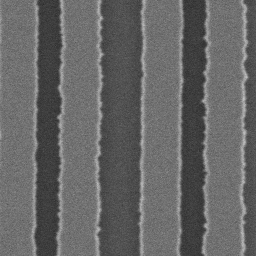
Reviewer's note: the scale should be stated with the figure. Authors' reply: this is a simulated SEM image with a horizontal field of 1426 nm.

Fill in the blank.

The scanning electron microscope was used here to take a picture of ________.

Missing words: lines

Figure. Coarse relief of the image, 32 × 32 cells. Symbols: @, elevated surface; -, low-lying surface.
@@@@@---@@@@------@@@@@---@@@@--
@@@@@---@@@@------@@@@@---@@@@@-
@@@@@---@@@@@-----@@@@@---@@@@@-
@@@@@---@@@@@-----@@@@@---@@@@@-
@@@@@---@@@@@-----@@@@@---@@@@@-
@@@@@---@@@@------@@@@@---@@@@@-
@@@@@---@@@@@-----@@@@@---@@@@@-
@@@@@---@@@@------@@@@@---@@@@@-
@@@@@---@@@@@-----@@@@@---@@@@--
@@@@@---@@@@@-----@@@@@---@@@@@-
@@@@@---@@@@@-----@@@@@---@@@@--
@@@@@--@@@@@------@@@@@---@@@@@-
@@@@@---@@@@@-----@@@@@--@@@@@@-
@@@@@---@@@@------@@@@@---@@@@@-
@@@@---@@@@@@-----@@@@@---@@@@--
@@@@---@@@@@------@@@@@---@@@@--
@@@@@--@@@@@------@@@@@---@@@@@-
@@@@@--@@@@@------@@@@@---@@@@@-
@@@@@--@@@@@------@@@@@---@@@@--
@@@@----@@@@------@@@@@--@@@@@--
@@@@----@@@@------@@@@@---@@@@@-
@@@@@---@@@@------@@@@@---@@@@--
@@@@---@@@@@------@@@@----@@@@@-
@@@@---@@@@@------@@@@---@@@@@--
@@@@---@@@@@------@@@@@---@@@@--
@@@@---@@@@@------@@@@----@@@@--
@@@@---@@@@@------@@@@----@@@@@-
@@@@---@@@@@-----@@@@@----@@@@--
@@@@---@@@@@------@@@@@---@@@@--
@@@@---@@@@@------@@@@----@@@@--
@@@@---@@@@@------@@@@---@@@@@--
@@@@---@@@@@------@@@@---@@@@@--